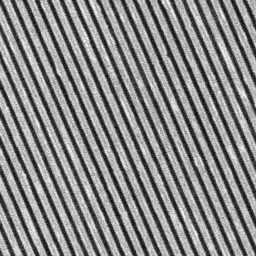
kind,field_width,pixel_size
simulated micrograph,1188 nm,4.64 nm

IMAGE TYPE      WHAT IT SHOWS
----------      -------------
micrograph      parallel lines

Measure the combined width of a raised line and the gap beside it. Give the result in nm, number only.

52.1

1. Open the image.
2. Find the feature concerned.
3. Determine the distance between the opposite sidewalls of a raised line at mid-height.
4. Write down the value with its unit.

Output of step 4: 26.6 nm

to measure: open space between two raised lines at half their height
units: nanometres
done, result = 22.4